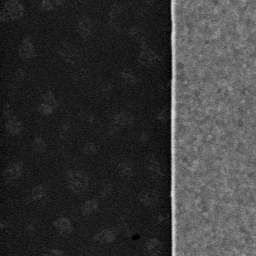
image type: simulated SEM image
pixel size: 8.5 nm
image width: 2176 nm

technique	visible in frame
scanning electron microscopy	one or a few lines or trenches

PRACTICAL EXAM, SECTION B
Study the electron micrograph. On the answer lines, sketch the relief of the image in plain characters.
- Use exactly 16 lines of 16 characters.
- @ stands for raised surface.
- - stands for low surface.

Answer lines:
-----------@@@@@
-----------@@@@@
-----------@@@@@
-----------@@@@@
-----------@@@@@
-----------@@@@@
-----------@@@@@
-----------@@@@@
-----------@@@@@
-----------@@@@@
-----------@@@@@
-----------@@@@@
-----------@@@@@
-----------@@@@@
-----------@@@@@
-----------@@@@@